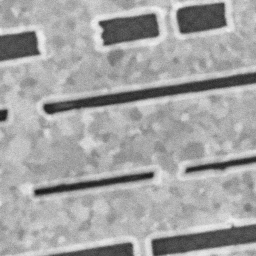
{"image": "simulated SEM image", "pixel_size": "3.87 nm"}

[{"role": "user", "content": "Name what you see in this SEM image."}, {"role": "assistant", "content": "one or a few lines or trenches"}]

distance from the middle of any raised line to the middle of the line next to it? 0.28 micrometres